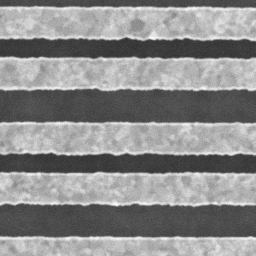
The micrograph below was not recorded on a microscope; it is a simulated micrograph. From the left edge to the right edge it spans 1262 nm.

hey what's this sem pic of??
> lines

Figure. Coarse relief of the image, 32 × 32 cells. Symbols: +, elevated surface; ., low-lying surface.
................................
++++++++++++++++++++++++++++++++
++++++++++++++++++++++++++++++++
++++++++++++++++++++++++++++++++
++++++++++++++++++++++++++++++++
................................
................................
++++++++++++++++++++++++++++++++
++++++++++++++++++++++++++++++++
++++++++++++++++++++++++++++++++
++++++++++++++++++++++++++++++++
................................
................................
................................
................................
++++++++++++++++++++++++++++++++
++++++++++++++++++++++++++++++++
++++++++++++++++++++++++++++++++
++++++++++++++++++++++++++++++++
................................
................................
................................
++++++++++++++++++++++++++++++++
++++++++++++++++++++++++++++++++
++++++++++++++++++++++++++++++++
.+....++..+..++++++.++++++.+.+++
................................
................................
................................
................................
++++++++++++++++++++++++++++++++
++++++++++++++++++++++++++++++++